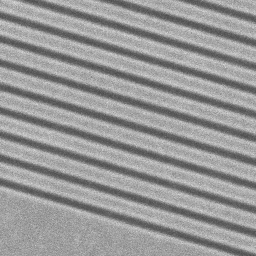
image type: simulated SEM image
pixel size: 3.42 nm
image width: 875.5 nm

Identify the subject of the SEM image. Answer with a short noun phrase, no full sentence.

parallel lines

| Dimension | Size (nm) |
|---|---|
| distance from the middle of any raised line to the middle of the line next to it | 78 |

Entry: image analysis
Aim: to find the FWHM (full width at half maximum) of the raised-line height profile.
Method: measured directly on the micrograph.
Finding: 50.8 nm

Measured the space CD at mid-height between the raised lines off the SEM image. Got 7.89 px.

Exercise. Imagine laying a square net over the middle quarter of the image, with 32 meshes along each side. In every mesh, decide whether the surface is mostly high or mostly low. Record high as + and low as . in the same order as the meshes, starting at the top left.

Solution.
+++.......+++++++++++++.......++
++++++........+++++++++++++.....
++++++++++.......+++++++++++++..
.+++++++++++++.......+++++++++++
....++++++++++++........++++++++
.......+++++++++++++.......+++++
+++........++++++++++++........+
++++++........++++++++++++......
++++++++++.......+++++++++++++..
.++++++++++++........+++++++++++
....++++++++++++........++++++++
........++++++++++++........++++
+++........++++++++++++........+
+++++++.......+++++++++++++.....
++++++++++........++++++++++++..
..+++++++++++........+++++++++++
....+++++++++++++.......++++++++
........++++++++++++........++++
+++........++++++++++++........+
+++++++........++++++++++++.....
++++++++++........++++++++++++..
.+++++++++++++.......+++++++++++
.....++++++++++++.......++++++++
........++++++++++++........++++
++++.......+++++++++++++.......+
+++++++........++++++++++++.....
++++++++++........++++++++++++..
.+++++++++++++........++++++++++
.....++++++++++++........+++++++
+.......+++++++++++++.......++++
++++.......+++++++++++++........
+++++++........++++++++++++.....